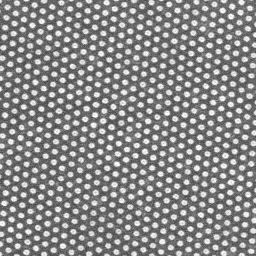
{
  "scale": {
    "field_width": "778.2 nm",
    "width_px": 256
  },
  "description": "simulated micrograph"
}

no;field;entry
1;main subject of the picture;a regular array of raised bodies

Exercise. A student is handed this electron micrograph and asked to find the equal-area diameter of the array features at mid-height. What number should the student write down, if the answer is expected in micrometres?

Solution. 0.0137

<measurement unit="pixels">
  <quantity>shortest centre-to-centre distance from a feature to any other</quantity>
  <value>10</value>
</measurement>